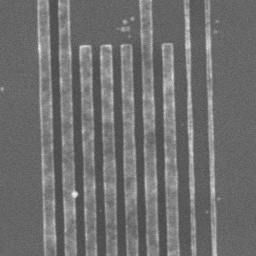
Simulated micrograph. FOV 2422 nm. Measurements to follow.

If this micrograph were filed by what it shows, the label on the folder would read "groups of lines, slits or small figures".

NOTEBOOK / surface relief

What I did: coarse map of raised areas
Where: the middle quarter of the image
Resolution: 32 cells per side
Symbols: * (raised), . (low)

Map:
**..***..***..***...**...**....*
**..***..***...**...**...**....*
**..***..***...**...**...**.....
**..***..***...**...**...**.....
**..***..***...**...**...**.....
**..***...**...**...**...**....*
**..***...**...**...**...**....*
**..***...**...**...**...**....*
**..***...**...**...**...**....*
**..***...**...**...**...***...*
**..***...**...**...**...***...*
**..***...**...**...**...***...*
**...**...**...**...**...***...*
**...**...**...**...**...***...*
**...**...**...**...**...***...*
**...**...**...**...***..***...*
**...**...**...**...***..***...*
**...**...**...**...***..***...*
**...**...**...**...***..***...*
**...**...**...***..***..***...*
**...**...**...***..***..***...*
**...**...**...***..***..***...*
**...**...**...***..***..***....
**...**...***..***..***..***....
**...**...***..***..***..***....
**...**...***..***..***..***....
***..***..***..***..***..***....
***..***..***..***..***..***....
***..***..***..***..***..***....
***..***..***..***..***..***....
***..***..***..***..***..***....
***..***..***..***..***..***....